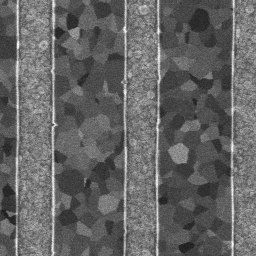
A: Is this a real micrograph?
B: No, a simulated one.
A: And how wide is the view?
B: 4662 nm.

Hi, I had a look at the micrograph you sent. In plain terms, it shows one or a few lines or trenches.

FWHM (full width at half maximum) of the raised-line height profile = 1330 nanometres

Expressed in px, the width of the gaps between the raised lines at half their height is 35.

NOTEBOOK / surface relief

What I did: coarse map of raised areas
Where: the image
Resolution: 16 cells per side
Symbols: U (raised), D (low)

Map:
UDDUUUUUDDUUUUUD
UDDUUUUUDDUUUUUD
UDDUUUUUDDUUUUUD
UDDUUUUUDDUUUUUD
UDDUUUUUDDUUUUUD
UDDUUUUUDDUUUUUD
UDDUUUUUDDUUUUUD
UDDUUUUUDDUUUUUD
UDDUUUUUDDUUUUUD
UDDUUUUUDDUUUUDD
UDDUUUUUDDUUUUDD
UDDUUUUUDDUUUUDD
UDDUUUUUDDUUUUUD
UDDUUUUUDDUUUUUD
UDDUUUUUDDUUUUUD
UDDUUUUUDDUUUUUD